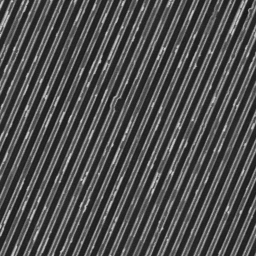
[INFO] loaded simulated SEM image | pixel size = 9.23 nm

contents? parallel lines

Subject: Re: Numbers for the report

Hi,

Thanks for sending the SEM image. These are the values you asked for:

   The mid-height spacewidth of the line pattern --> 56.2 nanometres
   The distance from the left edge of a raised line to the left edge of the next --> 0.103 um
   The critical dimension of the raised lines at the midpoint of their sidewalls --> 47.7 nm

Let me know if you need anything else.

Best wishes